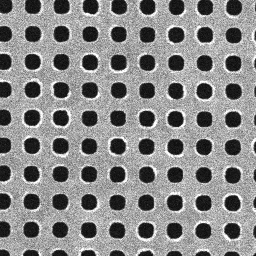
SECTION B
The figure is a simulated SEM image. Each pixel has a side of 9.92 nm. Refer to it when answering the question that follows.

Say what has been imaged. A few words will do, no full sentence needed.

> a regular array of holes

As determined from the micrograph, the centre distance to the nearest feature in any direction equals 276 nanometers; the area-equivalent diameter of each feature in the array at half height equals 158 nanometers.